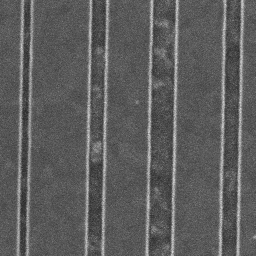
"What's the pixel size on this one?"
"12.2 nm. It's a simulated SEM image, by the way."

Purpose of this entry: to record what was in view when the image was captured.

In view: one or a few lines or trenches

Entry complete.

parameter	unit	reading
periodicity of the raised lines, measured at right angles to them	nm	851